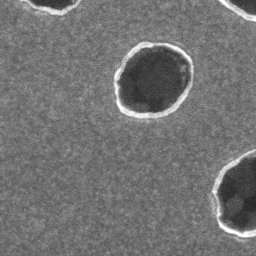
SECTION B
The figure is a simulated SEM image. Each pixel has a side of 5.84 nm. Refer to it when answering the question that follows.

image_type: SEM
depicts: raised bodies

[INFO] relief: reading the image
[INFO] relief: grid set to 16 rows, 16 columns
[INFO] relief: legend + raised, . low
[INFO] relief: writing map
..+++.........++
................
................
........++++....
.......+++++....
.......+++++....
.......++++.....
................
................
................
..............++
.............+++
..............++
..............++
..............++
................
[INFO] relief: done